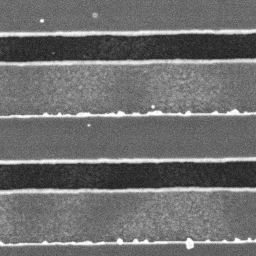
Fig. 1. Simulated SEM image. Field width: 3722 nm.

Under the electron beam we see lines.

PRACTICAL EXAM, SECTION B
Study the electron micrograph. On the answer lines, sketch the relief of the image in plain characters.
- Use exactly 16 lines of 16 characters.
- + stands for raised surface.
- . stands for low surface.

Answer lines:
++++++++++++++++
++++++++++++++++
................
................
++++++++++++++++
++++++++++++++++
++++++++++++++++
++++++++++++++++
++++++++++++++++
++++++++++++++++
................
................
++++++++++++++++
++++++++++++++++
++++++++++++++++
++++++++++++++++